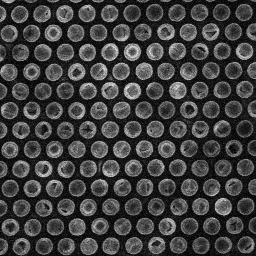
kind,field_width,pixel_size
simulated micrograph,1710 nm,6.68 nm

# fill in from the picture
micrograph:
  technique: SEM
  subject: a regular array of raised bodies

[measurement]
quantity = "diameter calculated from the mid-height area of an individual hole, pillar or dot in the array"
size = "108 nm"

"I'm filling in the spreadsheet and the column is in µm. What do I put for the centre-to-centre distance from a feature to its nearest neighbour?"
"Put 0.146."